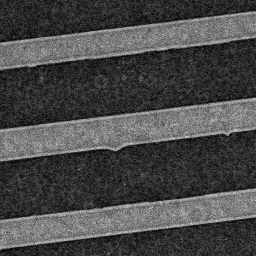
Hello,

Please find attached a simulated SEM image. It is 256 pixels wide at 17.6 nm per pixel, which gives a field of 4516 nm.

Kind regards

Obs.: one or a few lines or trenches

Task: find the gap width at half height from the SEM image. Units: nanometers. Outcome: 1080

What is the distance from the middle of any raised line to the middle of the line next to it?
1.56 µm